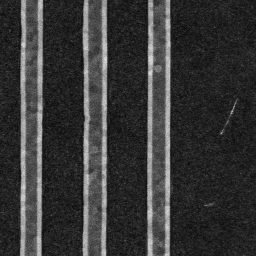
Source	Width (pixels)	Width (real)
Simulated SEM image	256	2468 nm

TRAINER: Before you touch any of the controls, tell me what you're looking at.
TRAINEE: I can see one or a few lines or trenches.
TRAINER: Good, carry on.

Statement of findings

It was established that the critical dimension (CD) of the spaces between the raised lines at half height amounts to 433 nm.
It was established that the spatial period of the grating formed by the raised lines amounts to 0.614 µm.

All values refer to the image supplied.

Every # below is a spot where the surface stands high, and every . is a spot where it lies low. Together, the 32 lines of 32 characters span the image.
...##......##......##...........
...##......##......##...........
...##......##......##...........
...##......##......##...........
...##......##......##...........
...##......##......##...........
...##......##......##...........
...##......##......##...........
...##......##......##...........
...##......##......##...........
...##......##......##...........
...##......##......##...........
...##......##......##...........
...##......##......##...........
...##......##......##...........
...##......##......##...........
...##......##......##...........
...##......##......##...........
...##......##......##...........
...##......##......##...........
...##......##......##...........
...##......##......##...........
...##......##......##...........
...##......##......##...........
...##......##......##...........
...##......##......##...........
...##......##......##...........
...##......##......##...........
...##......##......##...........
...##......##......##...........
...##......##......##...........
...##......##......##...........